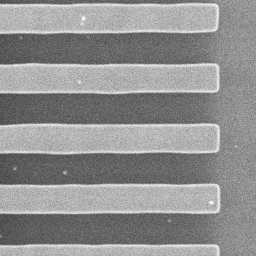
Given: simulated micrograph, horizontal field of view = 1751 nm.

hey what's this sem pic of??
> groups of lines, slits or small figures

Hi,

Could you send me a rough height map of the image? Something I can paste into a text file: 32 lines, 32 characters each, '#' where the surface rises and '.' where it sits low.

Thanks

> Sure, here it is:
................................
###########################.....
###########################.....
###########################.....
................................
................................
................................
................................
###########################.....
###########################.....
###########################.....
######################.####.....
................................
................................
................................
................................
###########################.....
###########################.....
###########################.....
................................
................................
................................
................................
###########################.....
###########################.....
###########################.....
###########################.....
................................
................................
................................
................................
###########################.....